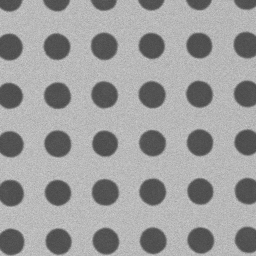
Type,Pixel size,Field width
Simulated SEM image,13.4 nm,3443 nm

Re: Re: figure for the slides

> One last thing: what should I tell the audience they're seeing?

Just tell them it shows a regular array of holes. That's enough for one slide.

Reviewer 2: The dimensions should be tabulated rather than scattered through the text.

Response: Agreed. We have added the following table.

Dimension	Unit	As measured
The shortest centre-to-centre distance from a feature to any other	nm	637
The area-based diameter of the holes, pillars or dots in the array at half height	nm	355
